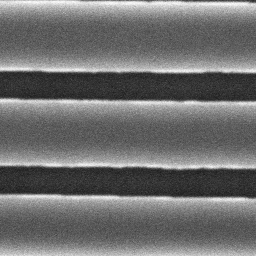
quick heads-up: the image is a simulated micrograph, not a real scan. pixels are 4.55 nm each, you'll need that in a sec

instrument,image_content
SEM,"lines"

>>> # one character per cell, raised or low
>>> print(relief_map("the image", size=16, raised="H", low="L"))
HHHHHHHHHHHHHHHH
HHHHHHHHHHHHHHHH
HHHHHHHHHHHHHHHH
HHHHHHHHHHHHHHHH
LLLLLLLLLLLLLLLL
LLLLLLLLLLLLLLLL
HHHHHHHHHHHHHHHH
HHHHHHHHHHHHHHHH
HHHHHHHHHHHHHHHH
HHHHHHHHHHHHHHHH
LLLLLLLLLLLHLLLL
LLLLLLLLLLLLLLLL
HHHHHHHHHHHHHHHH
HHHHHHHHHHHHHHHH
HHHHHHHHHHHHHHHH
HHHHHHHHHHHHHHHH